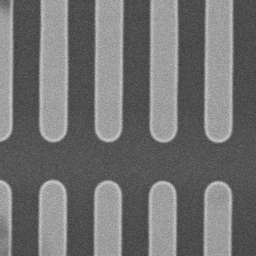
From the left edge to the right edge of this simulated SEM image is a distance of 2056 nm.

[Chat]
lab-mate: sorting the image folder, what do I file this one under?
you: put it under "groups of lines, slits or small figures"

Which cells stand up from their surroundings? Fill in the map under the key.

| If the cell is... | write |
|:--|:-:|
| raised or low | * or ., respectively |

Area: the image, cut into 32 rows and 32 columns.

**...***....***....***....***...
**...***....***....***....***...
*....***....***....***....***...
*....***....***....***....***...
*....***....***....***....***...
**...***....***....***....***...
**...***....***....***....***...
**...***....***....***....***...
*....***....***....***....***...
*....***....***....***....***...
*....***....***....***....***...
*....***....***....***....***...
*....***....***....***....***...
*....***....***....***....***...
*....***....***....***....***...
*....***....***....***....***...
*....***....***....***....***...
......*......*......*.....**....
................................
................................
................................
................................
................................
*....***....***....***....***...
*....***....***....***....***...
*....***....***....***....***...
*....***....***....***....***...
*....***....***....***....***...
*....***....***....***....***...
*....***....***....***....***...
*....***....***....***....***...
*....***....***....***....***...